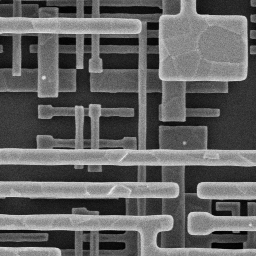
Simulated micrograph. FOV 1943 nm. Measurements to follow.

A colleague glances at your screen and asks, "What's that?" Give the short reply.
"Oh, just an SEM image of wiring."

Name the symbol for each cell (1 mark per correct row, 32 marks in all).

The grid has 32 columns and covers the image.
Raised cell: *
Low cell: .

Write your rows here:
.......................*........
......................***.......
*****************...***********.
******************..***********.
....................***********.
....................***********.
....................***********.
....................***********.
....................***********.
....................***********.
................................
................................
................................
................................
................................
................................
................................
................................
................................
********************************
********************************
................................
................................
**********************...*******
**********************...*******
................................
........................**......
**********************.*********
*********************..*********
..................**............
..................**............
********..........**************